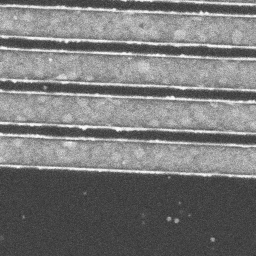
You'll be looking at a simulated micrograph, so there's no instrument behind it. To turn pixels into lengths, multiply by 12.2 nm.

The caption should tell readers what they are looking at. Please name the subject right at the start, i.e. parallel lines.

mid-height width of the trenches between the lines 29.2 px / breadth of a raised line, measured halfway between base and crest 13.2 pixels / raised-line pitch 0.527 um